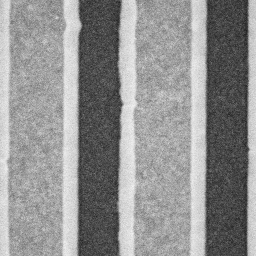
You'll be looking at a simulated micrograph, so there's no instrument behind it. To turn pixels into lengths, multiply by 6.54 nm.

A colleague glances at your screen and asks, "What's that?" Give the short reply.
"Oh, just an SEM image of one or a few lines or trenches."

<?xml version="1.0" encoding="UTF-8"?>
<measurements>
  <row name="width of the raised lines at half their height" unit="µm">0.451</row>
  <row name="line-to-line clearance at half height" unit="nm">376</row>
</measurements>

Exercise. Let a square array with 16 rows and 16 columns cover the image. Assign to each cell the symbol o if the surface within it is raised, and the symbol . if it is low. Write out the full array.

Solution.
oooo....oooo....
ooooo...oooo....
oooo....oooo....
oooo....oooo....
oooo....oooo....
oooo....oooo....
oooo....oooo....
oooo....oooo....
oooo....oooo....
oooo....oooo....
oooo....oooo....
oooo....oooo....
oooo....oooo....
oooo....oooo....
oooo....oooo....
oooo....oooo....